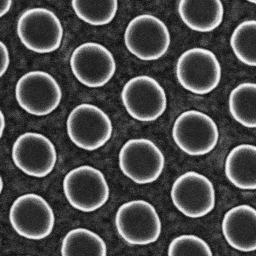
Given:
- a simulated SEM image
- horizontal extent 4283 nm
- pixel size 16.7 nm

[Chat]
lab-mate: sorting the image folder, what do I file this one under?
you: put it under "a regular array of raised bodies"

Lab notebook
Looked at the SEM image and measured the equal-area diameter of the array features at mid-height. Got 0.707 microns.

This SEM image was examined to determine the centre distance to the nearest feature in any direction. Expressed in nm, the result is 1020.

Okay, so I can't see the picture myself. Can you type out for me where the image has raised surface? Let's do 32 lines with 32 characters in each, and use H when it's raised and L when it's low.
HLLLLLLLLHHHHHLLLLLLLLLHHHHHLLLL
HLLLHHLLLLHHHHLLLLLLLLLHHHHHLLLL
LLLHHHHLLLLHHHLLLHHHLLLHHHHHLLLL
LLHHHHHHLLLLLLLLHHHHHLLLHHHLLLHH
LLLHHHHHLLLLLLLLHHHHHLLLLLLLLHHH
LLLHHHHLLLLLLLLLHHHHHLLLLLLLLHHH
HLLLLLLLLHHHHLLLLHHHLLLLHHLLLHHH
HLLLLLLLLHHHHHLLLLLLLLLHHHHLLLHH
HLLLLLLLLHHHHHLLLLLLLLHHHHHLLLLL
LLLHHHLLLLHHHHLLLLLLLLHHHHHLLLLL
LLHHHHHLLLLHHLLLHHHHLLLHHHHLLLLL
LLHHHHHLLLLLLLLLHHHHLLLLHLLLLHHH
LLHHHHHLLLLLLLLLHHHHHLLLLLLLLHHH
LLLHHHHLLLHHLLLLHHHHLLLLLLLLLHHH
LLLLLLLLLHHHHLLLLHHHLLLHHHLLLHHH
LLLLLLLLHHHHHHLLLLLLLLHHHHHLLLHH
LLLLLLLLLHHHHHLLLLLLLLHHHHHLLLLL
LLHHHHLLLHHHHLLLLLLLLLHHHHHLLLLL
LLHHHHHLLLLHLLLHHHHLLLLHHHLLLLHH
LLHHHHHLLLLLLLLHHHHHLLLLLLLLLHHH
LLHHHHHLLLLLLLLHHHHHLLLLLLLLHHHH
LLLHHHLLLHHHLLLLHHHHLLLLLLLLHHHH
LLLLLLLLHHHHHLLLLHHLLLHHHHLLLHHH
LLLLLLLLHHHHHLLLLLLLLLHHHHLLLLLL
LLLHLLLLHHHHHLLLLLLLLLHHHHHLLLLL
LLHHHHLLLHHHHLLLHHLLLLHHHHHLLLLL
LHHHHHLLLLLLLLLHHHHLLLLHHHLLLHHH
LHHHHHHLLLLLLLLHHHHHLLLLLLLLHHHH
LLHHHHLLLLLLLLLHHHHHLLLLLLLLHHHH
LLLHHLLLHHHHLLLHHHHHLLLLLLLLHHHH
LLLLLLLLHHHHHLLLLLLLLLHHHHLLLHHH
LLLLLLLLHHHHHLLLLLLLLHHHHHLLLLLL